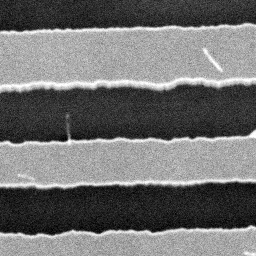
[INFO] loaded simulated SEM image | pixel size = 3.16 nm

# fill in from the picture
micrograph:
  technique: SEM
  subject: lines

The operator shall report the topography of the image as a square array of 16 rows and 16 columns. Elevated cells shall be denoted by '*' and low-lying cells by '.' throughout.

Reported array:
................
................
****************
****************
****************
................
................
................
...............*
****************
****************
*******.........
................
................
....*..**.******
****************